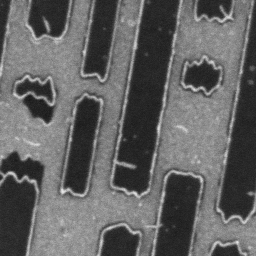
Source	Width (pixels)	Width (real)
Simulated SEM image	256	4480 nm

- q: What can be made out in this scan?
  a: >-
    parallel lines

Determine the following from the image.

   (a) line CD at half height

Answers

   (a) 655 nm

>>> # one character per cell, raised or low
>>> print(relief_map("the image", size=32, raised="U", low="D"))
UUDDUUUUUDDDUUUDDDUUUUUDUUUUUDDD
UDDUUUUUUDDUUUUDDDUUUUDDUUUUUDDU
UDDUUUUUUDDUUUUDDUUUUUDDDDDUDDDU
UDDDUUUUDDDUUUDDDUUUUUDDDDDDDDDU
UDDDUUUUDDDUUUDDDUUUUUDDDDDDDDDU
UDDDDDDDDDDUUUDDDUUUUUDDDDDDDDDU
UDDDDDDDDDUUUUDDDUUUUUDDDDDDDDUU
DDDDDDDDDDUUUUDDDUUUUDDDDUDDDDUU
DDDDDDDDDDUUUUDDUUUUUDDUUUUDDDUU
DDDDDDDDDDDDUDDDUUUUUDDUUUUUDDUU
DDUUUUUDDDDDDDDDUUUUUDDUUUUDDDUU
DDUUUUUDDDDDDDDDUUUUUDDDDDDDDDUU
DDDDDDUDDDUUDDDDUUUUUDDDDDDDDUUU
DDDDDDDDDUUUUDDUUUUUDDDDDDDDDUUU
DDDDDDDDDUUUUDDUUUUUDDDDDDDDDUUU
DDDDDDDDDUUUDDDUUUUUDDDDDDDDDUUU
DDDDDDDDDUUUDDDUUUUUDDDDDDDDDUUU
DDDDDDDDDUUUDDDUUUUUDDDDDDDDDUUU
DDDDDDDDDUUUDDDUUUUUDDDDDDDDUUUU
DDDDDDDDUUUUDDUUUUUDDDDDDDDDUUUU
DDDDDDDDUUUUDDUUUUUDDDDDDDDDUUUU
DDDDDDDDUUUDDDUUUUUDDUDDDDDDUUUU
UUUUDDDDUUUDDDUUUUUDDUUUUDDDUUUU
UUUUUDDDUUUDDDUUUUUDUUUUUDDDUUUU
UUUUUDDDDDDDDDDDDDDDUUUUUDDUUUUU
UUUUUDDDDDDDDDDDDDDDUUUUUDDUUUUU
UUUUDDDDDDDDDDDDDDDDUUUUUDDUUUUU
UUUUDDDDDDDDDDDDDDDDUUUUUDDDUDUD
UUUUDDDDDDDDDDUUDDDUUUUUDDDDDDDD
UUUUDDDDDDDDDUUUUUDUUUUUDDDDDDDD
UUUUDDDDDDDDDUUUUUDUUUUUDDDUUUDD
UUUDDDDDDDDDUUUUUDDUUUUUDDUUUUDD